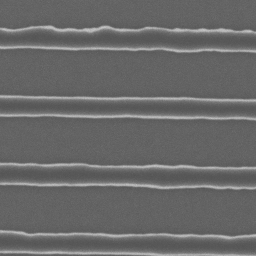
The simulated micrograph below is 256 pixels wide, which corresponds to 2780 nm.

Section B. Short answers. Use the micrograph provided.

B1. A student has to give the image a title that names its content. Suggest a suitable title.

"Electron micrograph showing one or a few lines or trenches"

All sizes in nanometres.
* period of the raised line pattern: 742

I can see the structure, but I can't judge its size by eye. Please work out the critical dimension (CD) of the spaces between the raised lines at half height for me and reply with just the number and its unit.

0.524 micrometres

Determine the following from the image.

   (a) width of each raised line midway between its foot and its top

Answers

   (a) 220 nm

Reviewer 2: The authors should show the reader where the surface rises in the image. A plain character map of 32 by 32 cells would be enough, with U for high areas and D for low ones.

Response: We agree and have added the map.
DDDDDDDDDDDDDDDDDDDDDDDDDDDDDDDD
DDDDDDDDDDDDDDDDDDDDDDDDDDDDDDDD
DDDDDDDDDDDDDDDDDDDDDDDDDDDDDDDD
DDDUUUUDDDDDDUDDDDUUDDDDDDDDDDDD
UUUUUUUUUUUUUUUUUUUUUUUUUUUUUUUU
UUUUUUUUUUUUUUUUUUUUUUUUUUUUUUUU
DDDDDDDDDDDDDDDDDDDDDDDDDDDDDDDD
DDDDDDDDDDDDDDDDDDDDDDDDDDDDDDDD
DDDDDDDDDDDDDDDDDDDDDDDDDDDDDDDD
DDDDDDDDDDDDDDDDDDDDDDDDDDDDDDDD
DDDDDDDDDDDDDDDDDDDDDDDDDDDDDDDD
DDDDDDDDDDDDDDDDDDDDDDDDDDDDDDDD
UUUUUUUUUUUUUUUUUUUUUUUUUUUDUUUD
UUUUUUUUUUUUUUUUUUUUUUUUUUUUUUUU
DDDDDDDDUUUUUUUUUUUUUUUUUUUUUUUU
DDDDDDDDDDDDDDDDDDDDDDDDDDDDDDDD
DDDDDDDDDDDDDDDDDDDDDDDDDDDDDDDD
DDDDDDDDDDDDDDDDDDDDDDDDDDDDDDDD
DDDDDDDDDDDDDDDDDDDDDDDDDDDDDDDD
DDDDDDDDDDDDDDDDDDDDDDDDDDDDDDDD
UUDDDDDDDUDDDDDDDDDDDDDDDDDDDDDD
UUUUUUUUUUUUUUUUUUUUUUUUUUUUUUUU
UUUUUUUUUUUUUUUUUUUUUUUUUUUUUUUU
DDDDDDDDDDDDDDDDDDDDDDDDDDDDDUDD
DDDDDDDDDDDDDDDDDDDDDDDDDDDDDDDD
DDDDDDDDDDDDDDDDDDDDDDDDDDDDDDDD
DDDDDDDDDDDDDDDDDDDDDDDDDDDDDDDD
DDDDDDDDDDDDDDDDDDDDDDDDDDDDDDDD
DDDDDDDDDDDDDDDDDDDDDDDDDDDDDDDD
UUUUUUUUUUUUUUDUUUUUUUDUUUUUDDDU
UUUUUUUUUUUUUUUUUUUUUUUUUUUUUUUU
DDDUUUUUUUUUUUUUUUUUUUUUUUUUUUUU